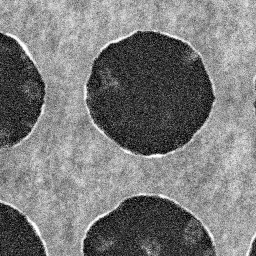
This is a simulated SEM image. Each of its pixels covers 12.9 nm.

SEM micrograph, holes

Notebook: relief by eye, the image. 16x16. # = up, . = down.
################
################
.######....#####
..####......####
..####.......###
...##........###
...##........###
..####.......###
..#####.....####
########...#####
################
################
########...#####
..####......####
..###........###
...##........###